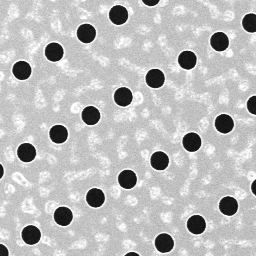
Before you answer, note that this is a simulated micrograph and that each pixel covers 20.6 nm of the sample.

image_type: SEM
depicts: a regular array of holes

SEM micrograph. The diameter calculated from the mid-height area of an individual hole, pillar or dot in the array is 406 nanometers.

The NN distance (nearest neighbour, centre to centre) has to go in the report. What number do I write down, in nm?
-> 760